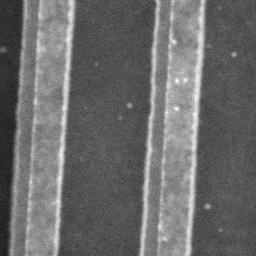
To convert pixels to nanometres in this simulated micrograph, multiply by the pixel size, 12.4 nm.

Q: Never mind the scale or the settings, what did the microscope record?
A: lines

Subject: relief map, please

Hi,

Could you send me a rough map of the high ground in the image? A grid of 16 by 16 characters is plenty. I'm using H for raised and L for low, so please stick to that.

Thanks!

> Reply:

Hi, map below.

LLHHLLLLLLHHHLLL
LLHHLLLLLLHHHLLL
LHHHLLLLLLHHLLLL
LHHHLLLLLLHHLLLL
LHHHLLLLLLHHLLLL
LHHHLLLLLLHHLLLL
LHHHLLLLLLHHLLLL
LHHHLLLLLHHHLLLL
LHHHLLLLLHHHLLLL
LHHHLLLLLHHHLLLL
LHHHLLLLLHHHLLLL
LHHHLLLLLHHHLLLL
LHHHLLLLLHHHLLLL
LHHHLLLLLHHHLLLL
LHHHLLLLLHHHLLLL
LHHLLLLLLHHHLLLL